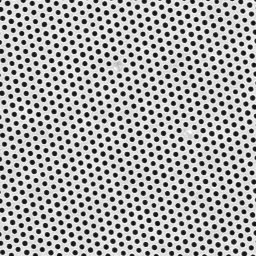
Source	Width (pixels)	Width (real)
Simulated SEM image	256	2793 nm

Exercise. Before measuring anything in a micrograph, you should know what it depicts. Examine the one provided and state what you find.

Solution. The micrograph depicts a regular array of holes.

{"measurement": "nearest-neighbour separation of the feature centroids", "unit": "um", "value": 0.0971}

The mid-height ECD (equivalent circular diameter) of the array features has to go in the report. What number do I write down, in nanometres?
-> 59.1